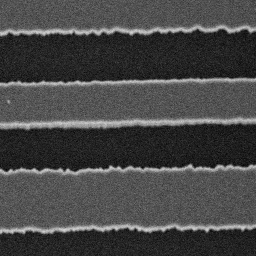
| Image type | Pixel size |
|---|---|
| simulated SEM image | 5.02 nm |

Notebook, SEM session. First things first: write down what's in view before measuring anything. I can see lines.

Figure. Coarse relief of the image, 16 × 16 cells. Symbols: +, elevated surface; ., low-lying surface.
++++++++++++++++
++++++++++++++++
................
................
................
++++++++++++++++
++++++++++++++++
++++++++++++++++
................
................
...........+.+++
++++++++++++++++
++++++++++++++++
++++++++++++++++
................
................